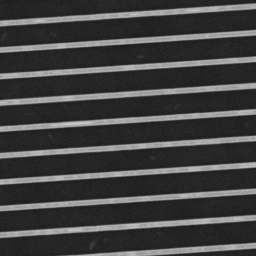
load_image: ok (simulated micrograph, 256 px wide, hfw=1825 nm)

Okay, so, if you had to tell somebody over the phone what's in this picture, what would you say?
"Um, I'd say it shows parallel lines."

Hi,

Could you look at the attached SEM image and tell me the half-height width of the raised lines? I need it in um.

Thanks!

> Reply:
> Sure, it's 0.0338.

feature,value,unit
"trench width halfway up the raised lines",21.9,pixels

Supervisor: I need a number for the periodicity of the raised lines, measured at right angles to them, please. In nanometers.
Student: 189